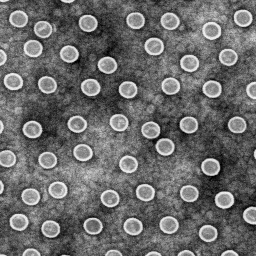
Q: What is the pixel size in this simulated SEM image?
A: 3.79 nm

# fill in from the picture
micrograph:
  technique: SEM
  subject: a regular array of raised bodies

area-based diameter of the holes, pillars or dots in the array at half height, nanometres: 62.5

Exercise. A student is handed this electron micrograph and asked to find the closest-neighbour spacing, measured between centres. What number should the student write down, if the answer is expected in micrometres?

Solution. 0.122